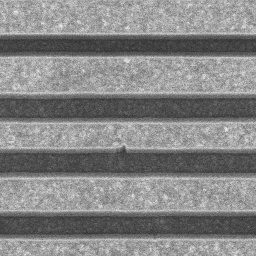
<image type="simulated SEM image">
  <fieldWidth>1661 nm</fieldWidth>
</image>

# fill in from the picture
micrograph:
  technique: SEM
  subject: parallel lines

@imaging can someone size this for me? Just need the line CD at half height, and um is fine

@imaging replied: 0.24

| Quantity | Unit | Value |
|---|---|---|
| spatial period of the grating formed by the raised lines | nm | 387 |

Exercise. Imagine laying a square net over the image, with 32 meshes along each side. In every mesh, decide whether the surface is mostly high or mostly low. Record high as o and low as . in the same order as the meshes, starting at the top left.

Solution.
oooooooooooooooooooooooooooooooo
oooooooooooooooooooooooooooooooo
oooooooooooooooooooooooooooooooo
oooooooooooooooooooooooooooooooo
o.........oooo..oo.ooooo.......o
................................
................................
oooooooooooooooooooooooooooooooo
oooooooooooooooooooooooooooooooo
oooooooooooooooooooooooooooooooo
oooooooooooooooooooooooooooooooo
oooooooooooooooooooooooooooooooo
................................
................................
................................
oooooooooooooooooooooooooooooooo
oooooooooooooooooooooooooooooooo
oooooooooooooooooooooooooooooooo
ooooooooooooooo.oooooooooooooooo
................................
................................
................................
oooooooooooooooooooooooooooooooo
oooooooooooooooooooooooooooooooo
oooooooooooooooooooooooooooooooo
oooooooooooooooooooooooooooooooo
oooooooooooooooooooooooooooooooo
................................
................................
................................
oooooooooooooooooooooooooooooooo
oooooooooooooooooooooooooooooooo